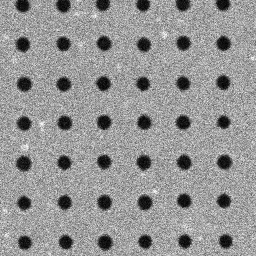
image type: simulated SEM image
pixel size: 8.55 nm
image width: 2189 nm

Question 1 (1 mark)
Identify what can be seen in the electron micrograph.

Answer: a regular array of holes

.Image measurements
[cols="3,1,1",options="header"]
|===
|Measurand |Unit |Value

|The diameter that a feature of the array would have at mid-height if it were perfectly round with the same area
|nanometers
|129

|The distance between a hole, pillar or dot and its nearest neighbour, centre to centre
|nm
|336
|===